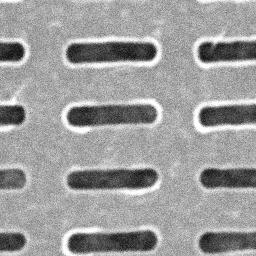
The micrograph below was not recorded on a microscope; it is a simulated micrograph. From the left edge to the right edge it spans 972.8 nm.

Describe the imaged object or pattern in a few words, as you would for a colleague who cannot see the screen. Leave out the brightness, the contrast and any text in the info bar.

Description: holes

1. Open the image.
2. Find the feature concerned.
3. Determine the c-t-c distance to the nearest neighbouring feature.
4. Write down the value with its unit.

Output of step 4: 240 nm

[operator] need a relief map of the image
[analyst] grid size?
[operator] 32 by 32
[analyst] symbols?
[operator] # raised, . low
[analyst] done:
################################
################################
################################
################################
################################
...######..........######.......
...#####............#####.......
...#####...........######.......
################################
################################
################################
################################
################################
...######..........######.......
...#####............#####.......
...######........########.......
################################
################################
################################
################################
################################
...######...........#####.......
...#####............#####.......
...######.........########.#....
################################
################################
################################
################################
################################
...######...........#####.......
...#####............#####.......
#########........########....###